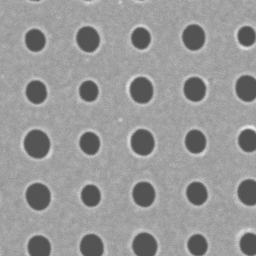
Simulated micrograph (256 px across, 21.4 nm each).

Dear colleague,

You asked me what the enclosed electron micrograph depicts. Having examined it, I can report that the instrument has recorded a regular array of holes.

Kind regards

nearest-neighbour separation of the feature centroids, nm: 1110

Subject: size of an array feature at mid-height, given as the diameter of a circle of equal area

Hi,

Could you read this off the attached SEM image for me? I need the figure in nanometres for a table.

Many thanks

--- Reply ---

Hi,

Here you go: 514